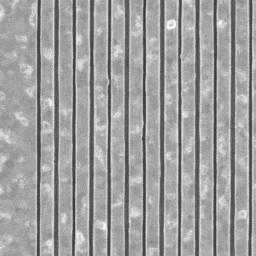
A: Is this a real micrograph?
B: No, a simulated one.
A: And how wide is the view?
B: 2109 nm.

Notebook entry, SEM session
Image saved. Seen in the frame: parallel lines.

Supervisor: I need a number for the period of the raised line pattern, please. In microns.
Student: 0.146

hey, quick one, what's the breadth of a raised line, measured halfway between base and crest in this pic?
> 0.112 µm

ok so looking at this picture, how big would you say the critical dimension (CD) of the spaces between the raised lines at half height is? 37.1 nm